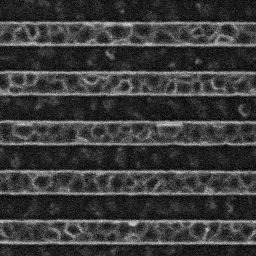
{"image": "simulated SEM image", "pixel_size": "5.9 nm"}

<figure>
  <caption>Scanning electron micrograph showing parallel lines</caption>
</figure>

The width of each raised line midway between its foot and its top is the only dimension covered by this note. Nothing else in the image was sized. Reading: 135 nanometres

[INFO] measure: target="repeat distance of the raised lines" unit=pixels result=49.6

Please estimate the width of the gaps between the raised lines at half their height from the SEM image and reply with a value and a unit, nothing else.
156 nm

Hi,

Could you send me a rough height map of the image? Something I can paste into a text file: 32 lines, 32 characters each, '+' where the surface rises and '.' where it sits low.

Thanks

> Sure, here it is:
................................
................................
................................
+++++++++++++.++++++++++++++++++
++++++++++++++..++++++++++++++++
++++++++++++++++++.+++++++++++++
................................
................................
................................
++++++++++++++++++++++++++++++++
++++++++++++++++++++++++++++++++
++++++++++++++++++++++++++++++++
................................
................................
................................
++++++++++++++++++++++++++++++++
++++++++++++++++++++++++++++++++
++++++++++++++++++++++++++++++++
................................
................................
................................
+++++++++++++++++++......+......
++++++++++++++++++++++++++++++++
++++++++++++++++++++++++++++++++
................................
................................
................................
................................
++++++++++++++++++++++++++++++++
++++++++++++++++++++++++++++++++
................................
................................